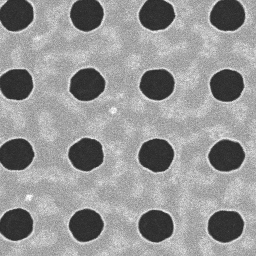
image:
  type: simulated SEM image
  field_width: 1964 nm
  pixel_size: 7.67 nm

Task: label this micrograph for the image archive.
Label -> a regular array of holes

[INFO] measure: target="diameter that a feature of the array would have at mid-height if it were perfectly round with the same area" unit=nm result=260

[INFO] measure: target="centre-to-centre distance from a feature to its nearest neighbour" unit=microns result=0.536